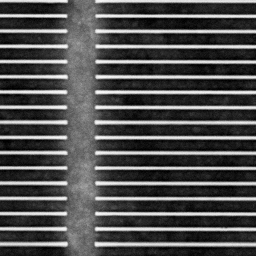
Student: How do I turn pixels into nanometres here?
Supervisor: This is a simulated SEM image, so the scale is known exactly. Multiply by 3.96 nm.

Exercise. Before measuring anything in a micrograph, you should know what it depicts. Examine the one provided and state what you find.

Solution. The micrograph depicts parallel lines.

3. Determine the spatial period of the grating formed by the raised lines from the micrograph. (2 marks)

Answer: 60.3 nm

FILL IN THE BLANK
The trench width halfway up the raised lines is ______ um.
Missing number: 0.049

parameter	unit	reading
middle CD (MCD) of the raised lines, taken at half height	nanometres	10.9